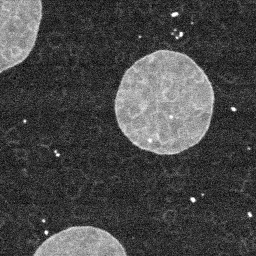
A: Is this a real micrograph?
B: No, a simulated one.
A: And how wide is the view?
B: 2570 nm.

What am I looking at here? raised bodies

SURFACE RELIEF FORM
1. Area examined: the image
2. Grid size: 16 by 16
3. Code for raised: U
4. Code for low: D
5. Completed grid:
UUUDDDDDDDDDDDDD
UUDDDDDDDDDDDDDD
UUDDDDDDDDDDDDDD
UUDDDDDDDUUUDDDD
DDDDDDDDUUUUUDDD
DDDDDDDUUUUUUDDD
DDDDDDDUUUUUUDDD
DDDDDDDUUUUUUDDD
DDDDDDDDUUUUUDDD
DDDDDDDDDDUDDDDD
DDDDDDDDDDDDDDDD
DDDDDDDDDDDDDDDD
DDDDDDDDDDDDDDDD
DDDDDDDDDDDDDDDD
DDDDUUUDDDDDDDDD
DDUUUUUUDDDDDDDD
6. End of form